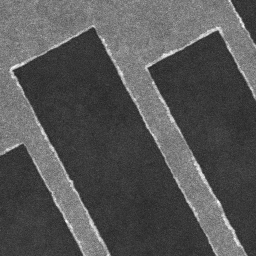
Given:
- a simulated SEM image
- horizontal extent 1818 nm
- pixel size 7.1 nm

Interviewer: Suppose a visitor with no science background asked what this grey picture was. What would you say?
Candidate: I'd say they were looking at one or a few lines or trenches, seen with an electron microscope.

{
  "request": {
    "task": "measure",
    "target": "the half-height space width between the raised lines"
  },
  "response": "0.663 micrometres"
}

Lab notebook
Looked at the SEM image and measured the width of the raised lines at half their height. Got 186 nm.